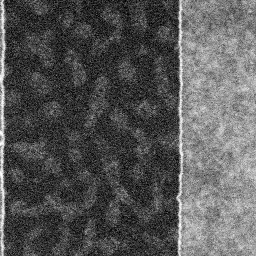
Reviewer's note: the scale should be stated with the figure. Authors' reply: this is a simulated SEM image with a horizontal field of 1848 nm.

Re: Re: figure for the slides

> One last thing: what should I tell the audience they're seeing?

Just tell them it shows one or a few lines or trenches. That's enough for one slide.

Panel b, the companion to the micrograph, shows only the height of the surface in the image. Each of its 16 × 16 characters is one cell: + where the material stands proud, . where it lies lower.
+++++++++++.....
+++++++++++.....
+++++++++++.....
+++++++++++.....
+++++++++++.....
+++++++++++.....
+++++++++++.....
+++++++++++.....
+++++++++++.....
+++++++++++.....
+++++++++++.....
+++++++++++.....
+++++++++++.....
+++++++++++.....
+++++++++++.....
+++++++++++.....